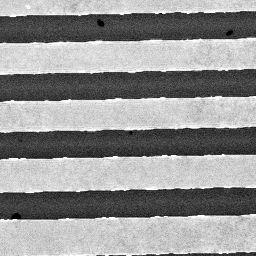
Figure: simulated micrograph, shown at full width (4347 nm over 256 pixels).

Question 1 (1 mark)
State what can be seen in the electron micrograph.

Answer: lines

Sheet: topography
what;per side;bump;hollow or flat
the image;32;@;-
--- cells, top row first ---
@@@@@@@@@@@@@@@@@@@@@@@@@@@@@@@@
@@@@@@@@@@@@@@@@@@@@@@-@--------
--------------------------------
--------------------------------
--------------------------------
------@@@@@@@@@@@@@@@@@@@@@@@@@@
@@@@@@@@@@@@@@@@@@@@@@@@@@@@@@@@
@@@@@@@@@@@@@@@@@@@@@@@@@@@@@@@@
@@@@@@@@@@@@@@@@@@@@@@@@@@@@@@@@
--------------------------------
--------------------------------
--------------------------------
-------------@@@@@@@@@@@@@@@@@@@
@@@@@@@@@@@@@@@@@@@@@@@@@@@@@@@@
@@@@@@@@@@@@@@@@@@@@@@@@@@@@@@@@
@@@@@@@@@@@@@@@@@@@@@@@@@@@@@@@@
--------------------------------
--------------------------------
--------------------------------
---------------------------@@@@@
@@@@@@@@@@@@@@@@@@@@@@@@@@@@@@@@
@@@@@@@@@@@@@@@@@@@@@@@@@@@@@@@@
@@@@@@@@@@@@@@@@@@@@@@@@@@@@@@@@
@@@@@@@@@@@@@@@@@@@@@@----------
--------------------------------
--------------------------------
--------------------------------
-------@@@@@@@@@@@@@@@@@@@@@@@@@
@@@@@@@@@@@@@@@@@@@@@@@@@@@@@@@@
@@@@@@@@@@@@@@@@@@@@@@@@@@@@@@@@
@@@@@@@@@@@@@@@@@@@@@@@@@@@@@@@@
@@@@@@@@@@@@@@@@@@@@@@@@@@@@@@--